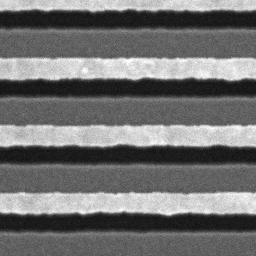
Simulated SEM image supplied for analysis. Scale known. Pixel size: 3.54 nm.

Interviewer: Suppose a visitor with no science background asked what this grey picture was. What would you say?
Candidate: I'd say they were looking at lines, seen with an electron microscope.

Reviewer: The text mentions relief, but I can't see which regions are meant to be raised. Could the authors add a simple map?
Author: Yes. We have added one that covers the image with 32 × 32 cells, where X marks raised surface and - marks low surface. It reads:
XXXXXXXXXXXXXXXXXXXXXXXXXXXXXXXX
-----------X--------------------
--------------------------------
--------------------------------
XXXXXXXXXXXXXXXXXXXXXXXXXXXXXXXX
XXXXXXXXXXXXXXXXXXXXXXXXXXXXXXXX
XXXXXXXXXXXXXXXXXXXXXXXXXXXXXXXX
XXXXXXXXXXXXXXXXXXXXXXXXXXXXXXXX
XXXXXXXXXXXXXXXXXXXXXXXXXXXXXXXX
XXXXXXXXXXXXXXXXXXXXXXXXXXXXXXXX
--------------------------------
--------------------------------
XXXXXXXXXXXXXXXXXXXXXXXXXXXXXXXX
XXXXXXXXXXXXXXXXXXXXXXXXXXXXXXXX
XXXXXXXXXXXXXXXXXXXXXXXXXXXXXXXX
XXXXXXXXXXXXXXXXXXXXXXXXXXXXXXXX
XXXXXXXXXXXXXXXXXXXXXXXXXXXXXXXX
XXXXXXXXXXXXXXXXXXXXXXXXXXXXXXXX
--------------------------------
--------------------------------
X----------------------------XX-
XXXXXXXXXXXXXXXXXXXXXXXXXXXXXXXX
XXXXXXXXXXXXXXXXXXXXXXXXXXXXXXXX
XXXXXXXXXXXXXXXXXXXXXXXXXXXXXXXX
XXXXXXXXXXXXXXXXXXXXXXXXXXXXXXXX
XXXXXXXXXXXXXXXXXXXXXXXXXXXXXXXX
XXXXXXXXXXXXXXXXXXXXXXXXXXXXXXXX
--------------------------------
--------------------------------
XXXXXXXXXXXXXXXXXXXXXXXXXXXXXXXX
XXXXXXXXXXXXXXXXXXXXXXXXXXXXXXXX
XXXXXXXXXXXXXXXXXXXXXXXXXXXXXXXX